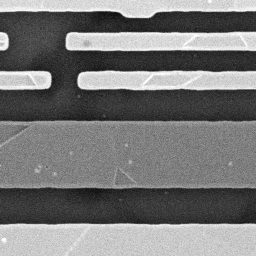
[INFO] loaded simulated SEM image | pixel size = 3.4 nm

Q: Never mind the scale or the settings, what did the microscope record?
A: wiring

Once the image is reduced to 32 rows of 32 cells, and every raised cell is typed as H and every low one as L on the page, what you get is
HHHHHHHHHHHHHHHHHHHHHHHHHHHHHHHH
LLLLLLLLLLLLLLHHHHHHLLLLLLLLLLLL
LLLLLLLLLLLLLLLLLLLLLLLLLLLLLLLL
LLLLLLLLLLLLLLLLLLLLLLLLLLLLLLLL
HLLLLLLLHHHHHHHHHHHHHHHHHHHHHHHH
HLLLLLLLHHHHHHHHHHHHHHHHHHHHHHHH
LLLLLLLLLLLLLLLLLLLLLLLLLLLLLLLL
LLLLLLLLLLLLLLLLLLLLLLLLLLLLLLLL
LLLLLLLLLLLLLLLLLLLLLLLLLLLLLLLL
HHHHHHLLLLHHHHHHHHHHHHHHHHHHHHHH
HHHHHHLLLLHHHHHHHHHHHHHHHHHHHHHH
LLLLLLLLLLLLLLLLLLLLLLLLLLLLLLLL
LLLLLLLLLLLLLLLLLLLLLLLLLLLLLLLL
LLLLLLLLLLLLLLLLLLLLLLLLLLLLLLLL
LLLLLLLLLLLLLLLLLLLLLLLLLLLLLLLL
HHHHHHHHHHHHHHHHHHHHHHHHHHHHHHHH
HHHHHHHHHHHHHHHHHHHHHHHHHHHHHHHH
HHHHHHHHHHHHHHHHHHHHHHHHHHHHHHHH
HHHHHHHHHHHHHHHHHHHHHHHHHHHHHHHH
HHHHHHHHHHHHHHHHHHHHHHHHHHHHHHHH
HHHHHHHHHHHHHHHHHHHHHHHHHHHHHHHH
HHHHHHHHHHHHHHHHHHHHHHHHHHHHHHHH
HHHHHHHHHHHHHHHHHHHHHHHHHHHHHHHH
LLLLLLLLLLLLLLLLLLLLLLLLLLLLLLLL
LLLLLLLLLLLLLLLLLLLLLLLLLLLLLLLL
LLLLLLLLLLLLLLLLLLLLLLLLLLLLLLLL
LLLLLLLLLLLLLLLLLLLLLLLLLLLLLLLL
LLLLLLLLLLLLLLLLLLLLLLLLLLLLLLLL
HHHHHHHHHHHHHHHHHHHHHHHHHHHHHHHH
HHHHHHHHHHHHHHHHHHHHHHHHHHHHHHHH
HHHHHHHHHHHHHHHHHHHHHHHHHHHHHHHH
HHHHHHHHHHHHHHHHHHHHHHHHHHHHHHHH